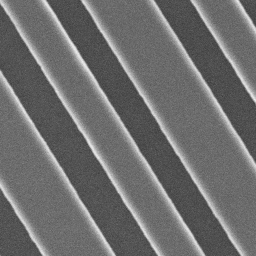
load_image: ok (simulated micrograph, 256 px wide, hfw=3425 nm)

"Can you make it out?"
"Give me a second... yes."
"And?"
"lines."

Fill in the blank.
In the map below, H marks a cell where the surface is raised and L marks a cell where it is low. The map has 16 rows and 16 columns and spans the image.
HHHLLHHHHHLLHHHL
LHHHLLHHHHHLLHHH
LLHHLLLHHHHLLLHH
LLHHHLLHHHHHLLHH
LLLHHHLLHHHHLLLH
HLLHHHLLHHHHHLLH
HLLLHHHLLHHHHHLL
HHLLLHHHLLHHHHLL
HHHLLHHHLLHHHHHL
HHHLLLHHHLLHHHHH
HHHHLLHHHLLLHHHH
HHHHLLLHHHLLHHHH
LHHHHLLLHHHLLHHH
LHHHHHLLHHHLLLHH
LLHHHHLLLHHHLLHH
LLHHHHHLLLHHLLLH